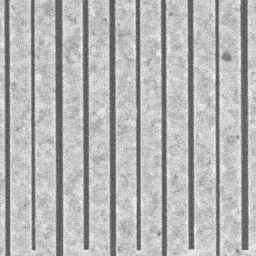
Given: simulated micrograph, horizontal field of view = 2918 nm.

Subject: parallel lines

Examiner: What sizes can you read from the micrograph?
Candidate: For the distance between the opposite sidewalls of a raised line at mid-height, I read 231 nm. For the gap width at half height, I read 68.4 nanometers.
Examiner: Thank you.